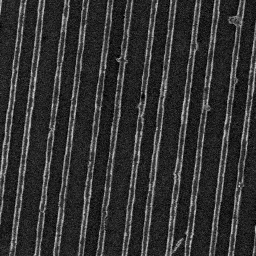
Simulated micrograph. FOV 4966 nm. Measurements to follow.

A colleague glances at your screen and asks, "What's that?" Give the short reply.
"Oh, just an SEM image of parallel lines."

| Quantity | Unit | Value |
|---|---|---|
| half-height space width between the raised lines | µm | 0.291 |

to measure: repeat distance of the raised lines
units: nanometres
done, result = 419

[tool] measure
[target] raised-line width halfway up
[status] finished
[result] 96.3 nm